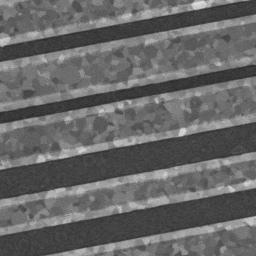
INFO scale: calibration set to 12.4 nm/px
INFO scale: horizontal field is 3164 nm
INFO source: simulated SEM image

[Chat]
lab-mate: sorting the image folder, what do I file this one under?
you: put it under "one or a few lines or trenches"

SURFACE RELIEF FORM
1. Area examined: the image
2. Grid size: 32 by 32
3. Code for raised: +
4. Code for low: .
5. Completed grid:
++++++++++++++++++++++++++......
+++++++++++++++++++++...........
+++++++++++++++...............++
++++++++++...............+++++++
+++++...............++++++++++++
..............++++++++++++++++++
.........+++++++++++++++++++++++
....++++++++++++++++++++++++++++
+++++++++++++++++++++++++++.....
++++++++++++++++++++++..........
++++++++++++++++.............+++
+++++++++++.............++++++++
++++++............++++++++++++++
.............+++++++++++++++++++
........++++++++++++++++++++++++
..++++++++++++++++++++++++++....
+++++++++++++++++++++++.........
++++++++++++++++++..............
++++++++++++....................
+++++++.........................
+.........................++++++
.....................+++++++++++
................++++++++++++++++
..........++++++++++++++++++++..
.....++++++++++++++++++++.......
+++++++++++++++++++.............
++++++++++++++..................
++++++++........................
+++.......................++++++
.....................+++++++++++
................++++++++++++++++
..........++++++++++++++++++++++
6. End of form